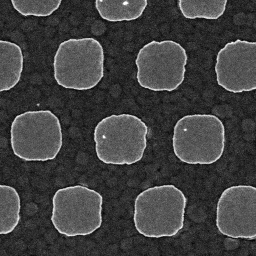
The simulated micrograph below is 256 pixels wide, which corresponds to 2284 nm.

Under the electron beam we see raised bodies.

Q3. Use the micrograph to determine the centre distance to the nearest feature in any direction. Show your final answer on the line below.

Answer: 733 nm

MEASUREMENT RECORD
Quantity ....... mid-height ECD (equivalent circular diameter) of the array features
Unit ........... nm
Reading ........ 464